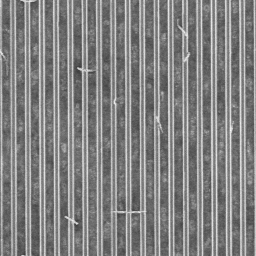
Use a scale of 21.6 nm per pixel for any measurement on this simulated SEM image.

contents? parallel lines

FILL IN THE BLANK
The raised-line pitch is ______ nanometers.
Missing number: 309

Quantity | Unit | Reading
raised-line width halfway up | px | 4.5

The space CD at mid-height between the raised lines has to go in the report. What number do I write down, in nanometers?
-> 210